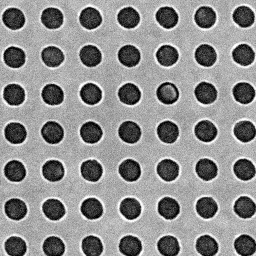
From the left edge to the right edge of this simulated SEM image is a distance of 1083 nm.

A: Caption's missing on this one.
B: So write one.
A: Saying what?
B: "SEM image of a regular array of holes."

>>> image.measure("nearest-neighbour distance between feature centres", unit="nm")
160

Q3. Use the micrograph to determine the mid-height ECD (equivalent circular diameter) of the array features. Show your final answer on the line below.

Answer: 97.6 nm